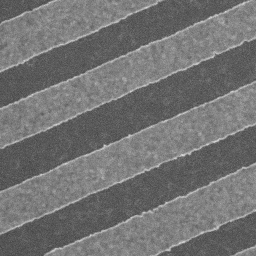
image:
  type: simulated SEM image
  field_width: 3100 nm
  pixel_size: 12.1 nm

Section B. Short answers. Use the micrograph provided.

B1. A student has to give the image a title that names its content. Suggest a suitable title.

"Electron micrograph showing one or a few lines or trenches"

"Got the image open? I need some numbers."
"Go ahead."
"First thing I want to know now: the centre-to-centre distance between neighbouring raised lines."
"0.934 um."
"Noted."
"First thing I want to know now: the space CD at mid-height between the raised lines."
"454 nm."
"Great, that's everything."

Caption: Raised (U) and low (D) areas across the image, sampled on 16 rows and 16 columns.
DDUUUUUUUDDDDDDU
UUUUUUUDDDDDUUUU
UUUUUDDDDDUUUUUU
UUDDDDDDUUUUUDDD
DDDDDUUUUUUDDDDD
DDDUUUUUUDDDDDDU
DUUUUUDDDDDDDUUU
UUUUDDDDDDUUUUUU
UUDDDDDDUUUUUUDD
DDDDDDUUUUUUDDDD
DDDDUUUUUUDDDDDU
DUUUUUUDDDDDDUUU
UUUUUDDDDDDUUUUU
UUUDDDDDDUUUUUUD
DDDDDDUUUUUUUDDD
DDDDUUUUUUUDDDDD